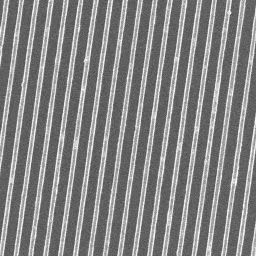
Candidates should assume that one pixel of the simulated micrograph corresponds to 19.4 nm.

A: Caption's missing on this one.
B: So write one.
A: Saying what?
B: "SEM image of parallel lines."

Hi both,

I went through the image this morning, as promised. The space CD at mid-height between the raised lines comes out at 209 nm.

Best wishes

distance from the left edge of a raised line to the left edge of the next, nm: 285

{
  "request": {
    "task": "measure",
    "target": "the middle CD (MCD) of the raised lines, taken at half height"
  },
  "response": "69.7 nanometers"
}